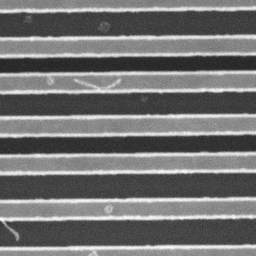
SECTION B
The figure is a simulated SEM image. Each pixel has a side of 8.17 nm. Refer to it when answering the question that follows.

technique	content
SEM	lines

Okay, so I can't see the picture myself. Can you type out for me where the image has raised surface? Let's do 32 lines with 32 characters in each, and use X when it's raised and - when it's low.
XXXXXXXXXXXXXXXXXXXXXXXXXXXXXXXX
XX--XX--------------------------
--------------------------------
--------------------------------
--------------------------------
XXXXXXXXXXXXXXXXXXXXXXXXXXXXXXXX
XXXXXXXXXXXXXXXXXXXXXXXXXXXXXXXX
--------------------------------
--------------------------------
XXXXXXXXXXXXXXXXXXXXXXXXXXXXXXXX
XXXXXXXXXXXXXXXXXXXXXXXXXXXXXXXX
XXXXXXXXXXXXXXX-----------------
--------------------------------
--------------------------------
------------XXXXXXXXXXXXXXXXXXXX
XXXXXXXXXXXXXXXXXXXXXXXXXXXXXXXX
XXXXXXXXXXXXXXXXXXXXXXXXXXXXXXXX
--------------------------------
--------------------------------
XXXXXXXXXXXXXXXXXXXXXXXXXXXXXXXX
XXXXXXXXXXXXXXXXXXXXXXXXXXXXXXXX
XXXXXXXXXXXXXXXXXXXXXXXXXXXXXXXX
--------------------------------
--------------------------------
--------------------------------
XXXXXXXXXXXXXXXXXXXXXXXXXXXXXXXX
XXXXXXXXXXXXXXXXXXXXXXXXXXXXXXXX
XXXXXXX-------------------------
--------------------------------
--------------------------------
--------------------------------
XXXXXXXXXXXXXXXXXXXXXXXXXXXXXXXX